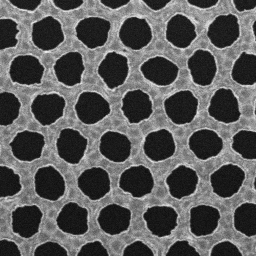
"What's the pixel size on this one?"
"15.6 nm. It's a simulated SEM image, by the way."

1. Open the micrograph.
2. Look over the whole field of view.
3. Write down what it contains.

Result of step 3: a regular array of holes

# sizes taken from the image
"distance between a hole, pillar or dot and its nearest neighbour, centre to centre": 660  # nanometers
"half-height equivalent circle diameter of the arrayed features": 510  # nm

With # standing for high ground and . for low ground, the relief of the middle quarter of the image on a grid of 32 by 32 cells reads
.....####.......###.........###.
.....###........###..........##.
.....###........####........####
....#####.......####........####
....######.....#######.....#####
#.#########...##########.#######
##################.###########.#
####.....######......######.....
####......#####.......####......
###........####.......###.......
###.........###.......###.......
###.........##........###.......
###........####.......###.......
###.......#####......#####......
####.....#######...########.....
################################
...#####################..######
....######....#######......#####
......###.......####.......####.
......###........###........###.
......###........###........###.
......###........###........####
.....####........###.......#####
.....#####......#####.....######
#...#########..#################
#################...#########.##
#####.....#####......######.....
####.......###........####......
####.......###........####......
###.........##.........##.......
.##.........##........####......
####.......####.......####......